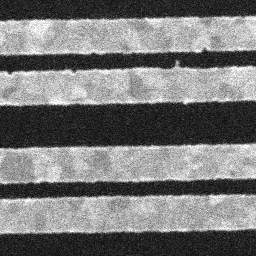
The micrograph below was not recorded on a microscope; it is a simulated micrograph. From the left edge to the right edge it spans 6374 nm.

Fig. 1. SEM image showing one or a few lines or trenches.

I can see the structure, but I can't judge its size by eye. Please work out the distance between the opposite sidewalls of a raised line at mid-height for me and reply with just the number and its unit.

806 nanometers